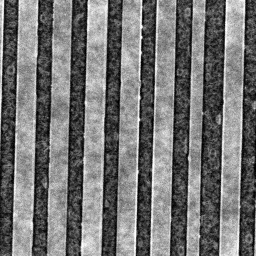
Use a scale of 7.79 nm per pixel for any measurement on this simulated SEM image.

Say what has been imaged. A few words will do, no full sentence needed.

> parallel lines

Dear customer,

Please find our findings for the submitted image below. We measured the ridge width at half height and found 148 nm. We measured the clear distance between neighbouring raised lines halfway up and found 124 nanometres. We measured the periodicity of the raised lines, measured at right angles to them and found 268 nm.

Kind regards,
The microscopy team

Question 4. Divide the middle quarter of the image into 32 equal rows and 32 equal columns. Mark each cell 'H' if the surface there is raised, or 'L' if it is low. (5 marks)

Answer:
HLLLLLHHHHLLLLHHHHHLLLLHHHHLLLLL
HLLLLLHHHHLLLLHHHHHLLLLHHHHLLLLL
HLLLLLHHHHLLLLHHHHHLLLLHHHHLLLLL
HLLLLLHHHHLLLLHHHHHLLLLHHHHLLLLL
HLLLLLHHHHLLLLHHHHHLLLLHHHHLLLLL
HLLLLLHHHHLLLLHHHHHLLLLHHHHLLLLL
HLLLLLHHHHLLLLHHHHHLLLLHHHHLLLLL
HLLLLLHHHHLLLLHHHHHLLLLHHHHLLLLL
HLLLLLHHHHLLLLHHHHHLLLLHHHHLLLLL
HLLLLHHHHHLLLLHHHHHLLLLHHHHLLLLL
HLLLLHHHHHLLLLHHHHHLLLLHHHHLLLLL
HLLLLHHHHHLLLLHHHHHLLLLHHHHLLLLL
HLLLLHHHHHLLLLHHHHHLLLLHHHHLLLLL
HLLLLHHHHHLLLLHHHHHLLLLHHHHLLLLL
HLLLLHHHHHLLLLHHHHHLLLLHHHHLLLLL
HLLLLHHHHHLLLLHHHHHLLLLHHHHLLLLL
HLLLLHHHHHLLLLHHHHHLLLLHHHHLLLLL
HLLLLHHHHHLLLLHHHHHLLLLHHHHLLLLL
HLLLLHHHHHLLLLHHHHHLLLHHHHHLLLLH
HLLLLHHHHHLLLLHHHHLLLLHHHHHLLLLH
HLLLLHHHHHLLLLHHHHLLLLHHHHHLLLLH
HLLLLHHHHHLLLLHHHHLLLLHHHHHLLLLH
HLLLLHHHHHLLLLHHHHLLLLHHHHHLLLLH
HLLLLHHHHHLLLLHHHHLLLLHHHHHLLLLH
HLLLLHHHHHLLLLHHHHLLLLHHHHHLLLLH
HLLLLHHHHHLLLLHHHHLLLLHHHHHLLLLH
HLLLLHHHHHLLLLHHHHLLLLHHHHHLLLLH
HLLLLHHHHHLLLLHHHHLLLLHHHHHLLLLH
HLLLLHHHHHLLLLHHHHLLLLHHHHHLLLLH
HLLLLHHHHHLLLLHHHHLLLLHHHHHLLLLH
HLLLLHHHHHLLLLHHHHLLLLHHHHHLLLLH
HLLLLHHHHHLLLLHHHHLLLLHHHHHLLLLH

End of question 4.